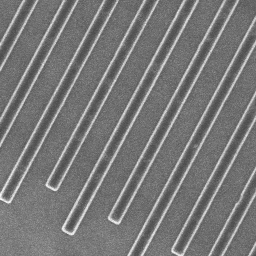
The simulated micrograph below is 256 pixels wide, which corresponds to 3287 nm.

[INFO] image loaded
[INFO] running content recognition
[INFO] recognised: parallel lines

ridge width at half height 156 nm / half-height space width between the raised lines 300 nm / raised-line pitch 455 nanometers